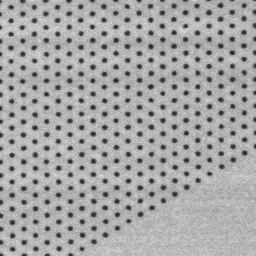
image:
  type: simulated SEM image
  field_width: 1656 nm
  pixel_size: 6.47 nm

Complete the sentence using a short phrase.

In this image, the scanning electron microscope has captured a regular array of holes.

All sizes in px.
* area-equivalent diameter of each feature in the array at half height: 5.16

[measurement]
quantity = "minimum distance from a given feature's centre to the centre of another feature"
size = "0.0849 µm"